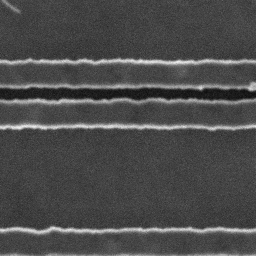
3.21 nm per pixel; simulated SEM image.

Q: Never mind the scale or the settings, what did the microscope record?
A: lines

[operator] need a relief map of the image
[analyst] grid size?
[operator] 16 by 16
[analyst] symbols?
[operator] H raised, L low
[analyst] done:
LLLLLLLLLLLLLLLL
LLLLLLLLLLLLLLLL
LLLLLLLLLLLLLLLL
LLLLLLLLLLLLLLLL
HHHHHHHHHHHHHHHH
HHLLHHHHHLHHHHHH
HHHHHHHHHHHHHHHH
HHHHHHHHHHHHHHHH
LLLLLLLLLLLLLLLL
LLLLLLLLLLLLLLLL
LLLLLLLLLLLLLLLL
LLLLLLLLLLLLLLLL
LLLLLLLLLLLLLLLL
LLLLLLLLLLLLLLLL
HHHHHHHHHHHHHHHH
HHHHHHHHHHHHHHHH